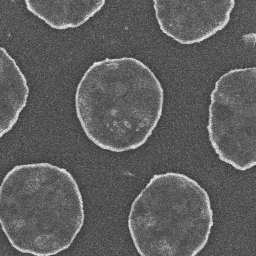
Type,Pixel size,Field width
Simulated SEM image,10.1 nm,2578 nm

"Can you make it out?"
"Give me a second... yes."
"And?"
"raised bodies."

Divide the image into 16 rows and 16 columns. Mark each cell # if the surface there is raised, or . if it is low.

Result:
..####....####..
...##.....####..
...........##...
#...............
#....####.....##
##...#####...###
##...#####...###
#....#####...###
......###....###
..............##
.###............
#####....###....
#####...#####...
#####...#####...
#####...#####...
.###.....####...